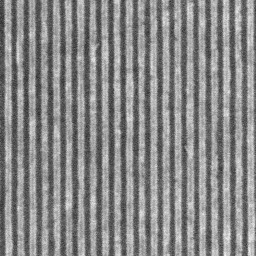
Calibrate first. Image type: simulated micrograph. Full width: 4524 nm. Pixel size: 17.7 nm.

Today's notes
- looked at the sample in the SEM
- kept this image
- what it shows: parallel lines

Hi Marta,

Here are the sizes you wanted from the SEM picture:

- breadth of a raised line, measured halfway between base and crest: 86.1 nanometers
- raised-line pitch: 214 nm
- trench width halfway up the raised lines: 137 nanometres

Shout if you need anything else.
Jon